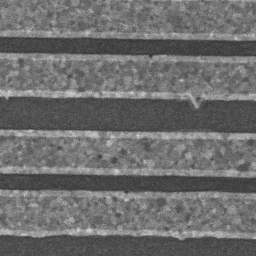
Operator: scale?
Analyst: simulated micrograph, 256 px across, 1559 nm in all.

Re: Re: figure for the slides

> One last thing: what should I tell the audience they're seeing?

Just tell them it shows one or a few lines or trenches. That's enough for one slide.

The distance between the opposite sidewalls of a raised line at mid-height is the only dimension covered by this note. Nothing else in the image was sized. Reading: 224 nm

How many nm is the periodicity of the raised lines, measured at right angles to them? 418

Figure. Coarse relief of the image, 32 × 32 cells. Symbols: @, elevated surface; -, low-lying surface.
@@@@@@@@@@@@@@@@@@@@@@@@@@@@@@@@
@@@@@@@@@@@@@@@@@@@@@@@@@@@@@@@@
@@@@@@@@@@@@@@@@@@@@@@@@@@@@@@@@
@@@@@@@@@@@@@@@@@@@@@@@@@@@@@@@@
----------------@@@@---@@@@@@@@@
--------------------------------
--------------------------------
@@@@@@@@@@@@@@@@@@@@@@@@@@@@--@@
@@@@@@@@@@@@@@@@@@@@@@@@@@@@@@@@
@@@@@@@@@@@@@@@@@@@@@@@@@@@@@@@@
@@@@@@@@@@@@@@@@@@@@@@@@@@@@@@@@
@@@@@@@@@@@@@@@@@@@@@@@@@@@@@@@@
------------------------@-------
--------------------------------
--------------------------------
--------------------------------
--------------------------------
@@@@@@@@@@@@@@@@@@@@@@@@@@@@@@@@
@@@@@@@@@@@@@@@@@@@@@@@@@@@@@@@@
@@@@@@@@@@@@@@@@@@@@@@@@@@@@@@@@
@@@@@@@@@@@@@@@@@@@@@@@@@@@@@@@@
------------------@----@@@@@@@@@
--------------------------------
--------------------------------
@@@@@@@@@@@@@@@@@@@@@@@@@@@@@---
@@@@@@@@@@@@@@@@@@@@@@@@@@@@@@@@
@@@@@@@@@@@@@@@@@@@@@@@@@@@@@@@@
@@@@@@@@@@@@@@@@@@@@@@@@@@@@@@@@
@@@@@@@@@@@@@@@@@@@@@@@@@@@@@@@@
----------------------@---------
--------------------------------
--------------------------------